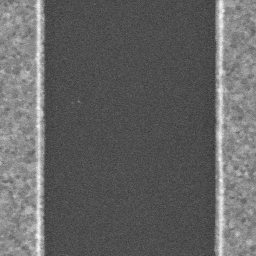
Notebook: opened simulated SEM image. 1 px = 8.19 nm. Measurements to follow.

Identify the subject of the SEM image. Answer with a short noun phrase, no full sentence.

one or a few lines or trenches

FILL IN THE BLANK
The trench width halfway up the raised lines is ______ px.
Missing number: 181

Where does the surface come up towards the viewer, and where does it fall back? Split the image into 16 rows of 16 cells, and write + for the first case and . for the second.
++............++
++............++
++............++
++............++
++............++
++............++
++............++
++............++
++............++
++............++
++............++
++............++
++............++
++............++
++............++
++............++